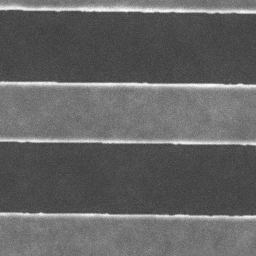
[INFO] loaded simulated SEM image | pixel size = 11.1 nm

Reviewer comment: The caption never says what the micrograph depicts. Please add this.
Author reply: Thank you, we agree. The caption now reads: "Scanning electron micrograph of lines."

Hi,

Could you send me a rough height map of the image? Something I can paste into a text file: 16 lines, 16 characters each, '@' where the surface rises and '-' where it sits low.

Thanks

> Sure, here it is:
@@@@@@@@@@@@@@@@
----------------
----------------
----------------
----------------
@@@@@@@@@@@@@@@@
@@@@@@@@@@@@@@@@
@@@@@@@@@@@@@@@@
@@@@@@@@@@@@@@@@
----------------
----------------
----------------
----------------
@@@@@@@@@@@@----
@@@@@@@@@@@@@@@@
@@@@@@@@@@@@@@@@